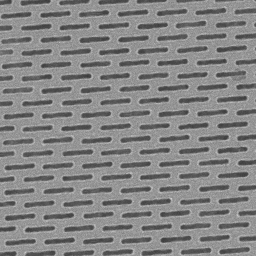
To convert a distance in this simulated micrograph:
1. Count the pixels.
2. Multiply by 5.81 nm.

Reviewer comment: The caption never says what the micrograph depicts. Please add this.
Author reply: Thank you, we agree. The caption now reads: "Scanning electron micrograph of a regular array of holes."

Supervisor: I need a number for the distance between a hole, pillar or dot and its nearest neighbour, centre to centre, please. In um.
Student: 0.131